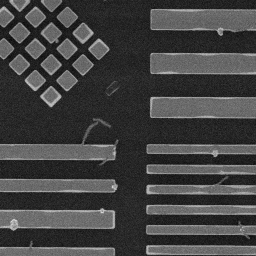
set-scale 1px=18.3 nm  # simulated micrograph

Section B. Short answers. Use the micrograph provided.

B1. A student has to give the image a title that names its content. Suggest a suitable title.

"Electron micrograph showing groups of lines, slits or small figures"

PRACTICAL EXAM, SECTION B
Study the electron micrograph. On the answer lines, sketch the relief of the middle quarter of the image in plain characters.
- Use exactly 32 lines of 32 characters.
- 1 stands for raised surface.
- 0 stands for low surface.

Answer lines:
00111110000000000000001111111111
00011100000000000000001111111111
11001000000000000000000000000000
11100000000000000000000000000000
11100000000000000000000000000000
11000000000000000000000000000000
00000000000000000000000000000000
00000000000000000000000000000000
00000000000000000000000111101111
00000000000000000000001111111111
00000000000000000000001111111111
00000000000000000000001111111111
00000000000000000000001111111111
00000000000000000000000000000000
00000000000000000000000000000000
00000000000000000000000000000000
00000000000000000000000000000000
00000000000000000000000000000000
00000000000000000000000000000000
00000000000000000000000000000000
11111111101110000000011111111111
11111111111110000000011111111111
11111111111110000000000000000000
11111111111110000000000000000000
00000000000000000000000000000000
00000000000000000000011111111111
00000000000000000000011111111111
00000000000000000000000000000000
00000000000000000000000000000000
11111111111110000000000000000000
11111111111110000000001111111111
11111111111110000000011111111111